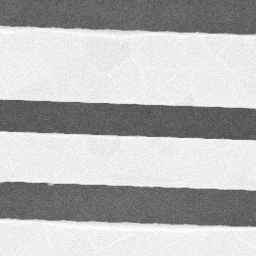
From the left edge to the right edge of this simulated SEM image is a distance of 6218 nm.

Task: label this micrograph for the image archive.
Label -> lines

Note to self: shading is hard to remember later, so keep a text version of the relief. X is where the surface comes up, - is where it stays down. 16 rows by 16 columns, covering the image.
----------------
----------------
XXXXXXXXXXXXXXXX
XXXXXXXXXXXXXXXX
XXXXXXXXXXXXXXXX
XXXXXXXXXXXXXXXX
--------XXXXXXXX
----------------
XXXXXXX---------
XXXXXXXXXXXXXXXX
XXXXXXXXXXXXXXXX
------XXXXXXXXXX
----------------
----------------
XXXXXXXXXXXXXXXX
XXXXXXXXXXXXXXXX